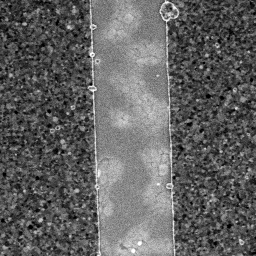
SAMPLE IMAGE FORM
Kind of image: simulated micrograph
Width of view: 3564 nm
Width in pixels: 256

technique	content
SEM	one or a few lines or trenches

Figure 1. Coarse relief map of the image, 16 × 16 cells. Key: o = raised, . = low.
oooooo....oooooo
oooooo....oooooo
oooooo....oooooo
oooooo....oooooo
oooooo....oooooo
oooooo.....ooooo
oooooo.....ooooo
oooooo.....ooooo
oooooo.....ooooo
oooooo.....ooooo
oooooo.....ooooo
oooooo.....ooooo
oooooo.....ooooo
oooooo.....ooooo
oooooo.....ooooo
oooooo.....ooooo